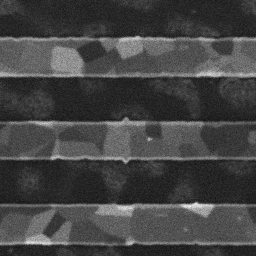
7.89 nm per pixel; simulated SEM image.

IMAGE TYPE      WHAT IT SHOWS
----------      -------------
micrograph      one or a few lines or trenches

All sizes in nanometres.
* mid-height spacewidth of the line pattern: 366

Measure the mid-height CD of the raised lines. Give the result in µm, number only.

0.295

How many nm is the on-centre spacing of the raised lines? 658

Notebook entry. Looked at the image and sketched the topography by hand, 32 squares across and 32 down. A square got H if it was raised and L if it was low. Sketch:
LLLLLLLLLLLLLLLLLLLLLLLLLLLLLLLL
LLLLLLLLLLLLLLLLLLLLLLLLLLLLLLLL
LLLLLLLLLLLLLLLLLLLLLLLLLLLLLLLL
LLLLLLLLLLLLLLLLLLLLLLLLLLLLLLLL
LLLLLLLLLLLLLLLLLLLLLLLLLLLLLLLL
HHHHHHHHHHHHHHHHHHHHHHHHHHHHHHHH
HHHHHHHHHHHHHHHHHHHHHHHHHHHHHHHH
HHHHHHHHHHHHHHHHHHHHHHHHHHHHHHHH
HHHHHHHHHHHHHHHHHHHHHHHHHHHHHHHH
LLLLLLLLLLLLLLLLLLLLLLLLLLLLLLHL
LLLLLLLLLLLLLLLLLLLLLLLLLLLLLLLL
LLLLLLLLLLLLLLLLLLLLLLLLLLLLLLLL
LLLLLLLLLLLLLLLLLLLLLLLLLLLLLLLL
LLLLLLLLLLLLLLLLLLLLLLLLLLLLLLLL
LLLLLLLLLLLLLLLLLLLLLLLLLLLLLLLL
HHHHHHHHHHHHHHHHHHHHHHHHHHHHHHHH
HHHHHHHHHHHHHHHHHHHHHHHHHHHHHHHH
HHHHHHHHHHHHHHHHHHHHHHHHHHHHHHHH
HHHHHHHHHHHHHHHHHHHHHHHHHHHHHHHH
HHHHHHHHHHHHHHHHHHHHHHHHHHHHHHHH
LLLLLLLLLLLLLLLLLLLLLLLLLLLLLLLL
LLLLLLLLLLLLLLLLLLLLLLLLLLLLLLLL
LLLLLLLLLLLLLLLLLLLLLLLLLLLLLLLL
LLLLLLLLLLLLLLLLLLLLLLLLLLLLLLLL
LLLLLLLLLLLLLLLLLLLLLLLLLLLLLLLL
LLLLLLLLLLLLLLLLLLLLLLLLLLLLLLLL
HHHHHHHHHHHHHHHHHHHHHHHHHHHHHHHH
HHHHHHHHHHHHHHHHHHHHHHHHHHHHHHHH
HHHHHHHHHHHHHHHHHHHHHHHHHHHHHHHH
HHHHHHHHHHHHHHHHHHHHHHHHHHHHHHHH
LLLLLLLLLLLLLHLLLLLLLLLLLLLLLLLL
LLLLLLLLLLLLLLLLLLLLLLLLLLLLLLLL